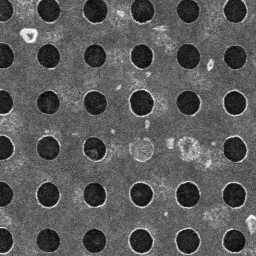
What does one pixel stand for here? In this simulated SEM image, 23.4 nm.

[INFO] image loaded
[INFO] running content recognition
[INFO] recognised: a regular array of holes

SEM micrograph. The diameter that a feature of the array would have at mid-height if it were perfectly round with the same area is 559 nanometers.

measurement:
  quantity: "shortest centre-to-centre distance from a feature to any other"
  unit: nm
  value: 1080